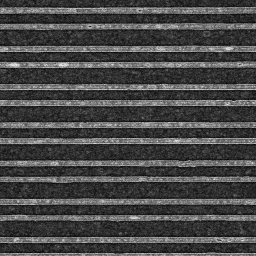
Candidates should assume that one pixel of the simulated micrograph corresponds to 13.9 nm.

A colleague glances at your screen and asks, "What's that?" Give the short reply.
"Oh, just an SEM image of parallel lines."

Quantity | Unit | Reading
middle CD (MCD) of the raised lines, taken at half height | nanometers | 76.5